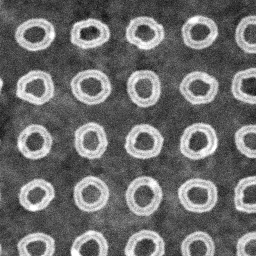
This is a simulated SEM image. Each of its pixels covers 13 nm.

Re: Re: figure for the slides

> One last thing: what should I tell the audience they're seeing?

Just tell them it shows a regular array of ring-shaped raised bodies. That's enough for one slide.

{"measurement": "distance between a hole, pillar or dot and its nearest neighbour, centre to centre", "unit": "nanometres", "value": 691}